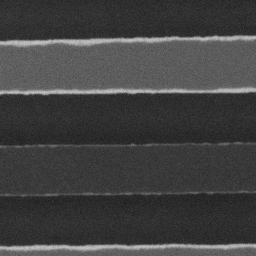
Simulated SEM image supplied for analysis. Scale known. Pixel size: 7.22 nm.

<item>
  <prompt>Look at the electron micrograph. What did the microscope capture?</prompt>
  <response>lines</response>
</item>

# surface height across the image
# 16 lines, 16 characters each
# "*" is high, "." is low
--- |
................
................
........********
****************
****************
****************
................
................
................
****************
****************
****************
................
................
................
****************